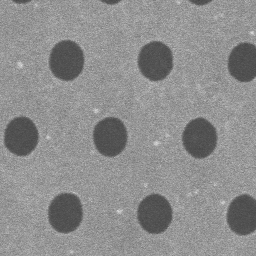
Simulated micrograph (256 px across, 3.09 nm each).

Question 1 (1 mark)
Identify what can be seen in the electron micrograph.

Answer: holes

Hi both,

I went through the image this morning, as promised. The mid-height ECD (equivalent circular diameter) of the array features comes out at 117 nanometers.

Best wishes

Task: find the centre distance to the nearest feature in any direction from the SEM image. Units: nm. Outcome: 273